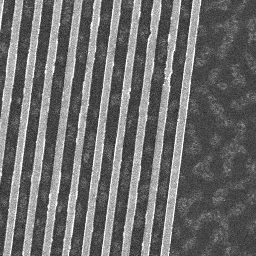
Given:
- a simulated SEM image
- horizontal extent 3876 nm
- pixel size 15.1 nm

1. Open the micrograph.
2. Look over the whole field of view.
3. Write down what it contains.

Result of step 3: parallel lines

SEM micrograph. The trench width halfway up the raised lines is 186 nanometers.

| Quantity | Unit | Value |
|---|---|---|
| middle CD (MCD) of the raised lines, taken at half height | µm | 0.113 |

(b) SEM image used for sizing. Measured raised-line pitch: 296 nm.